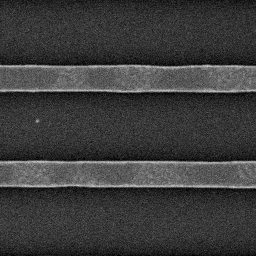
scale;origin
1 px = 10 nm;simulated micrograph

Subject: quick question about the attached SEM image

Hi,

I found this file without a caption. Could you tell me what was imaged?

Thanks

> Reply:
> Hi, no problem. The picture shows wiring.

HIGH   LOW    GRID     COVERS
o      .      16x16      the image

................
................
................
................
oooooooooooooooo
oooooooooooooooo
................
................
................
................
oooooooooooooooo
oooooooooooooooo
................
................
................
................